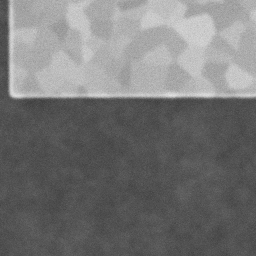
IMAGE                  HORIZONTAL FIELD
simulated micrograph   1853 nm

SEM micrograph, wiring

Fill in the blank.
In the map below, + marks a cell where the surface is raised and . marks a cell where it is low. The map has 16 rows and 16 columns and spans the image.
.+++++++++++++++
.+++++++++++++++
.+++++++++++++++
.+++++++++++++++
.+++++++++++++++
.+++++++++++++++
................
................
................
................
................
................
................
................
................
................